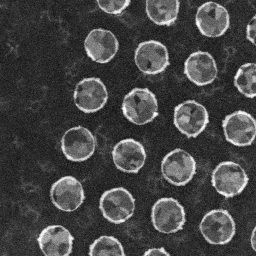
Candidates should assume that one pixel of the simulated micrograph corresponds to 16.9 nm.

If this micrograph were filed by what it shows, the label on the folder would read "a regular array of raised bodies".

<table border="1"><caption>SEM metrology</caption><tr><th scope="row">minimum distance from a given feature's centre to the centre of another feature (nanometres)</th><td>846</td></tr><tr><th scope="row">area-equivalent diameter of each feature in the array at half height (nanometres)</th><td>581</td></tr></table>